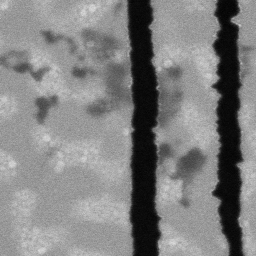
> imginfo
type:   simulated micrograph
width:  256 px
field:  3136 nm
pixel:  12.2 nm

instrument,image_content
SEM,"one or a few lines or trenches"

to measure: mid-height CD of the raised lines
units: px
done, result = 26.1